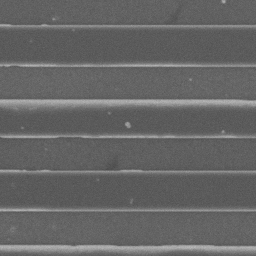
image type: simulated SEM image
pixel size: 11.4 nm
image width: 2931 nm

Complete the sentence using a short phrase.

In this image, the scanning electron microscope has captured lines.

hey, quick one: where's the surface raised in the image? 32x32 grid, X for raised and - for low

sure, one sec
--------------------------------
--------------------------------
--------------------------------
XXXXXXXXXXXXXXXXXXXXXXXXXXXXXXXX
XXXXXXXXXXXXXXXXXXXXXXXXXXXXXXXX
XXXXXXXXXXXXXXXXXXXXXXXXXXXXXXXX
XXXXXXXXXXXXXXXXXXXXXXXXXXXXXXXX
XXXXXXXXXXXXXXXXXXXXXXXXXXXXXXXX
--------------------------------
--------------------------------
--------------------------------
--------------------------------
--------------------------------
XXXXXXXXXXXXXXXXXXXXXXXXXXXXXXXX
XXXXXXXXXXXXXXXXXXXXXXXXXXXXXXXX
XXXXXXXXXXXXXXXXXXXXXXXXXXXXXXXX
XXXXXXXXXXXXXXXXXXXXXXXXXXXXXXXX
--------------------------------
--------------------------------
--------------------------------
--------------------------------
XXXXXXXXXXXXXXXXXXXXXXXXXXXXXXXX
XXXXXXXXXXXXXXXXXXXXXXXXXXXXXXXX
XXXXXXXXXXXXXXXXXXXXXXXXXXXXXXXX
XXXXXXXXXXXXXXXXXXXXXXXXXXXXXXXX
XXXXXXXXXXXXXXXXXXXXXXXXXXXXXXXX
--------------------------------
--------------------------------
--------------------------------
--------------------------------
--------------------------------
XXXXXXXXXXXXXXXXXXXXXXXXXXXXXXXX